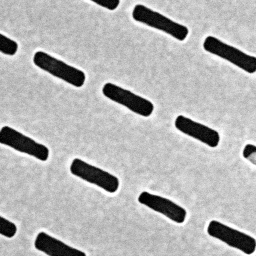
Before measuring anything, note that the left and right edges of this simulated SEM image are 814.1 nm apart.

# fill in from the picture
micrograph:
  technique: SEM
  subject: holes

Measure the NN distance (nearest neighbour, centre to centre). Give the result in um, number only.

0.241